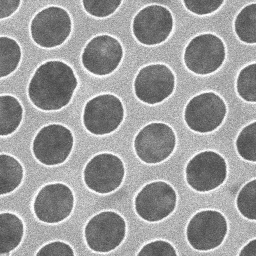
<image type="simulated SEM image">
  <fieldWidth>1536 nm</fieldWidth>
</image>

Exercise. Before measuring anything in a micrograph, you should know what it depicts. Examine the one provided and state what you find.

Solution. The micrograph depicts a regular array of holes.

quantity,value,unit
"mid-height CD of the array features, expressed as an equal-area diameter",0.248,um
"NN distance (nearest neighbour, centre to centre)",0.351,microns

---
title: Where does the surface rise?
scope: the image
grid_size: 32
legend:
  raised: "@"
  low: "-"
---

---@@@@@@@-----@@@@@@@@-----@@@-
--@@@---@@@---@@@----@@@---@@@--
@@@@-----@@@@@@@@-----@@@@@@@---
@@@@-----@@@@@@@@-------@@@@@---
@@@@-----@@@--@@@----@-@@--@@@--
--@@@---@@@----@@@--@@@-----@@@@
---@@@@@@@-----@@@@@@@@-----@@@@
---@@@@@@@-----@@@@@@@@-----@@@@
--@@@----@@----@@@---@@----@@@--
-@@@--------@@@@@-----@@@@@@@@--
@@@@--------@@@@@-----@@@--@@---
@@@@-----@@@@@@@@-----@@@@@@@@--
--@@-----@@----@@----@@@----@@@-
---@@---@@@----@@@@@@@@-----@@@@
---@@@@@@@------@@@@@@@-----@@@@
---@@@-@@@-----@@@@--@@-----@@@-
--@@@----@@---@@@-----@@@-@@@@--
@@@@-----@@@@@@@@-----@@@@@@@@--
@@@@-----@@@@@@@@-----@@@@@@@@--
-@@@-----@@@---@@----@@@----@@--
---@@--@@@@----@@@@@@@@-----@@@@
---@@@@@@@------@@@@@@@-----@@@@
---@@@@@@@-----@@@@@@@@-----@@@@
--@@@----@@----@@@----@@---@@@--
@@@------@@@@@@@@-----@@@@@@@@--
@@-------@@@@@@@@-----@@@@@@@@--
@@-------@@@@-@@@-----@@@--@@@--
----@---@@@-----@@--@@@@----@@@@
---@@@@@@@@-----@@@@@@@-----@@@@
---@@@@@@@@-----@-@@@@@-----@@@@
--@@@@--@@@----@@@---@@@----@@@-
-@@@@----@@@--@@@-----@@@@@@@@--